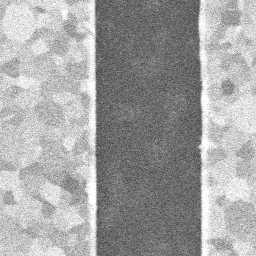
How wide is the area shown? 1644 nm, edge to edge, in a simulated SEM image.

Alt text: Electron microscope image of one or a few lines or trenches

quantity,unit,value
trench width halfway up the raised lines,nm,714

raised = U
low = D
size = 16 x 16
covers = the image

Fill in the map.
UUUUUUDDDDDDDUUU
UUUUUUDDDDDDDUUU
UUUUUUDDDDDDDUUU
UUUUUUDDDDDDDUUU
UUUUUUDDDDDDDUUU
UUUUUUDDDDDDDUUU
UUUUUUDDDDDDDUUU
UUUUUUDDDDDDDUUU
UUUUUUDDDDDDDUUU
UUUUUUDDDDDDDUUU
UUUUUUDDDDDDDUUU
UUUUUUDDDDDDDUUU
UUUUUUDDDDDDDUUU
UUUUUUDDDDDDDUUU
UUUUUUDDDDDDDUUU
UUUUUUDDDDDDDUUU